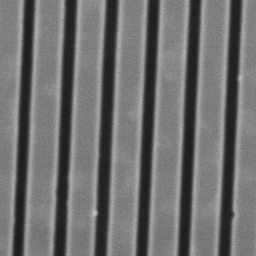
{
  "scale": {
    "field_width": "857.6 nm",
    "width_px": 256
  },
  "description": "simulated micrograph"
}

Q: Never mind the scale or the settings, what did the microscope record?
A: parallel lines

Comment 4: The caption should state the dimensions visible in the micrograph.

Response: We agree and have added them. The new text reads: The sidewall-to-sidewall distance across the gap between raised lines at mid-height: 38.1 nanometres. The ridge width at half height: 0.1 um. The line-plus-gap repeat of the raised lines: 0.139 micrometres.